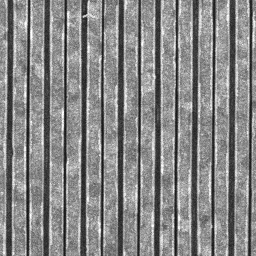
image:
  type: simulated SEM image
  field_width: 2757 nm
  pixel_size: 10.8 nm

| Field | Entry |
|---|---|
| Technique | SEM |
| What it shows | parallel lines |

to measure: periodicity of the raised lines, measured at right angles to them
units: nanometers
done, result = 200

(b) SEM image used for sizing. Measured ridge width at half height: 147 nanometers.